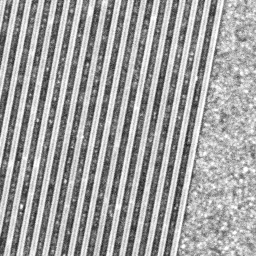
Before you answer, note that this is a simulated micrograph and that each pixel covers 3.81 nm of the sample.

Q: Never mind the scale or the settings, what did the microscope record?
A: parallel lines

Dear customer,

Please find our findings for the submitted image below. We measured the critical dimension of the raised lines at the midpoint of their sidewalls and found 0.0177 micrometres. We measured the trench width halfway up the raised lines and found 0.0281 um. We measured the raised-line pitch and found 47.9 nm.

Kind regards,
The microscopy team